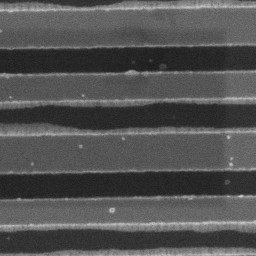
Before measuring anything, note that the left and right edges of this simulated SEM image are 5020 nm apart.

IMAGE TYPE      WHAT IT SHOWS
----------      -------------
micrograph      lines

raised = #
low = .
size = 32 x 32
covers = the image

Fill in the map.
................................
################################
################################
################################
################################
################################
................................
................................
................................
################################
################################
################################
##############################..
................................
................................
................................
....###.........#..#############
################################
################################
################################
################################
########........................
................................
................................
.......................#........
################################
################################
################################
................................
................................
................................
................................